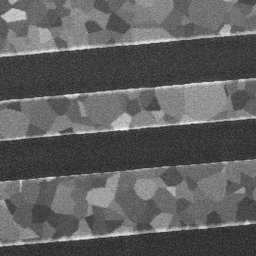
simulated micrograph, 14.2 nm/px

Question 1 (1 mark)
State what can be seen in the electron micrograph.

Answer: lines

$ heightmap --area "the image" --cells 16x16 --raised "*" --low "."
****************
****************
***********.....
................
................
.........*******
****************
**************..
***.............
................
.........*******
****************
****************
****************
**********......
................